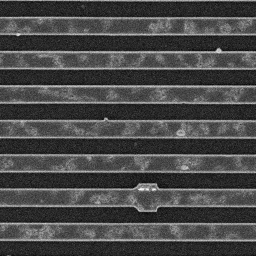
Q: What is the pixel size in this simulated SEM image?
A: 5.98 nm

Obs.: parallel lines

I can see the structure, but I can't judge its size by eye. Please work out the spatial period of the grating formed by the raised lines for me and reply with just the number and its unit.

0.205 um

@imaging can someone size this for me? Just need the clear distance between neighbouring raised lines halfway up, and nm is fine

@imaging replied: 99.4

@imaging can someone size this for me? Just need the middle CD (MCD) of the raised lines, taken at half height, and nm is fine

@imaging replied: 105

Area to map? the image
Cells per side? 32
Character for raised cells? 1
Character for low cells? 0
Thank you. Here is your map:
00000000000000000000000000000000
00000000000000000000000000000000
11111111111111111111111111111111
11111111111111111111111111111111
00000000000000000000000000000000
00000000000000000000000000000000
11000000000000000000000000010000
11111111111111111111111111111111
11111111111111111111111111111111
00000000000000000000000000000000
00000000000000000000000000000000
11111111111111111111111111111111
11111111111111111111111111111111
00000000000000000000000000000000
00000000000000000000000000000000
11111111111111111111111111111111
11111111111111111111111111111111
00000000000000000000000000000000
00000000000000000000000000000000
11111111111111111111111111111111
11111111111111111111111111111111
00000000000000000111111111111111
00000000000000000000000000000000
00000000000000000111000000000000
11111111111111111111111111111111
11111111111111111111111111111111
00000000000000000000000000000000
00000000000000000000000000000000
11111111111111111111111111111111
11111111111111111111111111111111
00000000000000000000000000000000
00000000000000000000000000000000